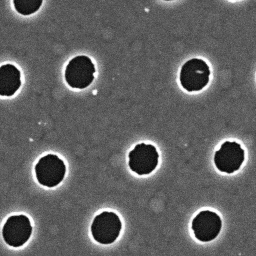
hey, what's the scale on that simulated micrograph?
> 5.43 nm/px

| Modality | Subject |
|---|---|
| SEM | a regular array of holes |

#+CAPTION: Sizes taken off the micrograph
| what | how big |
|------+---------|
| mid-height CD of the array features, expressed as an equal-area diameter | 172 nm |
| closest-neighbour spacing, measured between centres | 408 nanometers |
